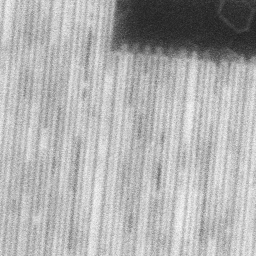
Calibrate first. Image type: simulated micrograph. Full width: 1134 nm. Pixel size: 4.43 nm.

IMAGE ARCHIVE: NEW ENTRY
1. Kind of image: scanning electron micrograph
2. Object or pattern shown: parallel lines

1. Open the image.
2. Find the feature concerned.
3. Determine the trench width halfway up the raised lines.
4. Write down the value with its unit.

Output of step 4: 0.0165 micrometres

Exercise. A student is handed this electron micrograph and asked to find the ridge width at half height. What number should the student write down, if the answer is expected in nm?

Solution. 12.7